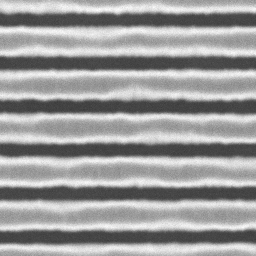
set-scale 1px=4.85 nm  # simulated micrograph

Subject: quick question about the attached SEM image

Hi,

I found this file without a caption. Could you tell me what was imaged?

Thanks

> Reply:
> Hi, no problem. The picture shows lines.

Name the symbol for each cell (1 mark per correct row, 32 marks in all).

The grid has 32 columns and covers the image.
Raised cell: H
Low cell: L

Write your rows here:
HHHHHHHHHHHHHHHHHHHHHHHHHHHHHHHH
LLLLHLLLLLHHHHHHHLLLHHHHHHHHHLLH
LLLLLLLLLLLLLLLLLLLLLLLLLLLLLLLL
HHHHLLLLLLLLLLLLHHHLLLLLLLLLLHHH
HHHHHHHHHHHHHHHHHHHHHHHHHHHHHHHH
HHHHHHHHHHHHHHHHHHHHHHHHHHHHHHHH
HHHHHHHHHHHHHHHHHHHHHHHHHHHHHHHH
LLLLLLLLLLLLLLLLLLLLLLLLLLLLLLLL
LLLLLLLLLLLLLLLLLLLLLLLLLLLLLLLL
HHHHHHHHHHHHHHHHHHHHHHHHHHHHHHHH
HHHHHHHHHHHHHHHHHHHHHHHHHHHHHHHH
HHHHHHHHHHHHHHHHHHHHHHHHHHHHHHHH
LLLLLLLLLLLLLLLLLLLLLLLLLLLLHLLL
LLLLLLLLLLLLLLLLLLLLLLLLLLLLLLLL
HHHHHHHHHHHHHHHHHHHHHHHHHHHHHHHH
HHHHHHHHHHHHHHHHHHHHHHHHHHHHHHHH
HHHHHHHHHHHHHHHHHHHHHHHHHHHHHHHH
HHHHHHHHHHHHHHHHHHHHHHHHHHHHHHHH
LLLLLLLLLLLLLLLLLLLLLLLLLLLLLLLL
LLLLLLLLLLLLLLLLLLLLLLLLLLLLLLLL
HHHHHHHHHHHHHHHHHHHHHHHHHHHHHHHH
HHHHHHHHHHHHHHHHHHHHHHHHHHHHHHHH
HHHHHHHHHHHHHHHHHHHHHHHHHHHHHHHH
LLLLLLLLLLLLLLLLLLLLLLLLLLLLLLLL
LLLLLLLLLLLLLLLLLLLLLLLLLLLLLLLL
HHHHHHHHHHHHHHHHHHHHHHHHHHHHHHHH
HHHHHHHHHHHHHHHHHHHHHHHHHHHHHHHH
HHHHHHHHHHHHHHHHHHHHHHHHHHHHHHHH
HHHHHHHHHHHHHHHHHHHHHHHHHHHHHHHH
LLLLLLLLLLLLLLLLLLLLLLLLLLLLLLLL
LLLLLLLLLLLLLLLLLLLLLLLLLHHLHHHL
HHHHHHHHHHHHHHHHHHHHHHHHHHHHHHHH